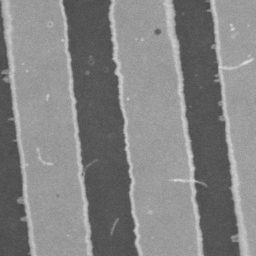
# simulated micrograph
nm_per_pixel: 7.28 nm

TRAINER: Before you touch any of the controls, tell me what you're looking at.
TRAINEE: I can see lines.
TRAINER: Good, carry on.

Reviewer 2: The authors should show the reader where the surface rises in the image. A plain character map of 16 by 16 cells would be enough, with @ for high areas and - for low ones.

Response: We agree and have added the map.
@@@@---@@@@--@@@
@@@@---@@@@--@@@
@@@@---@@@@--@@@
-@@@---@@@@---@@
-@@@@--@@@@---@@
-@@@@--@@@@---@@
-@@@@---@@@@--@@
-@@@@---@@@@--@@
-@@@@---@@@@--@@
-@@@@---@@@@--@@
-@@@@---@@@@--@@
-@@@@---@@@@---@
--@@@---@@@@---@
--@@@@--@@@@---@
--@@@@--@@@@@--@
--@@@@---@@@@--@